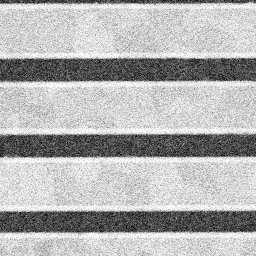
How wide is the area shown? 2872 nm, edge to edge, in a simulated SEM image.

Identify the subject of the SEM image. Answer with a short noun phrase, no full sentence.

one or a few lines or trenches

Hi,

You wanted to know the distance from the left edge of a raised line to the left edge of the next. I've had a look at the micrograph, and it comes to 860 nanometres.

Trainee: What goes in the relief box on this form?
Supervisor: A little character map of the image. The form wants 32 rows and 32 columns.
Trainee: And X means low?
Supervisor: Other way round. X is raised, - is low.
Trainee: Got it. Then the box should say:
--------------------------------
XXXXXXXXXXXXXXXXXXXXXXXXXXXXXXXX
XXXXXXXXXXXXXXXXXXXXXXXXXXXXXXXX
XXXXXXXXXXXXXXXXXXXXXXXXXXXXXXXX
XXXXXXXXXXXXXXXXXXXXXXXXXXXXXXXX
XXXXXXXXXXXXXXXXXXXXXXXXXXXXXXXX
XXXXXXXXXXXXXXXXXXXXXXXXXXXXXXXX
--------------------------------
--------------------------------
--------------------------------
X------------------XXXXX-----XX-
XXXXXXXXXXXXXXXXXXXXXXXXXXXXXXXX
XXXXXXXXXXXXXXXXXXXXXXXXXXXXXXXX
XXXXXXXXXXXXXXXXXXXXXXXXXXXXXXXX
XXXXXXXXXXXXXXXXXXXXXXXXXXXXXXXX
XXXXXXXXXXXXXXXXXXXXXXXXXXXXXXXX
--------------------------------
--------------------------------
--------------------------------
--------------------------------
XXXXXXXXXXXXXXXXXXXXXXXXXXXXXXXX
XXXXXXXXXXXXXXXXXXXXXXXXXXXXXXXX
XXXXXXXXXXXXXXXXXXXXXXXXXXXXXXXX
XXXXXXXXXXXXXXXXXXXXXXXXXXXXXXXX
XXXXXXXXXXXXXXXXXXXXXXXXXXXXXXXX
XXXXXXXXXXXXXXXXXXXXXXXXXXXXXXXX
--------------------------------
--------------------------------
--------------------------------
XXXXXXXXXXXXXXXXXXXXXXXXXXXXXXXX
XXXXXXXXXXXXXXXXXXXXXXXXXXXXXXXX
XXXXXXXXXXXXXXXXXXXXXXXXXXXXXXXX